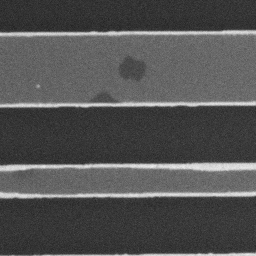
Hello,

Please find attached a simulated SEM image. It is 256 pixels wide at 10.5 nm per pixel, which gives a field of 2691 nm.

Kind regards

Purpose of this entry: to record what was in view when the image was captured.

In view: lines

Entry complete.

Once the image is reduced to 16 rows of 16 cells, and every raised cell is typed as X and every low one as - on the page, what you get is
----------------
----------------
XXXXXXXXXXXXXXXX
XXXXXXXXXXXXXXXX
XXXXXXXXXXXXXXXX
XXXXXXXXXXXXXXXX
XXXXXXXXXXXXXXXX
----------------
----------------
----------------
XXXXXXXXXXXXXXXX
XXXXXXXXXXXXXXXX
----------------
----------------
----------------
----------------